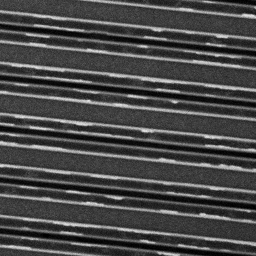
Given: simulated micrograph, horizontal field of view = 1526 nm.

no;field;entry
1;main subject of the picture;parallel lines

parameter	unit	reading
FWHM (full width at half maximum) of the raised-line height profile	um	0.0704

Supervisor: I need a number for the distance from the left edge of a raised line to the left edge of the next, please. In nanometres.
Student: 151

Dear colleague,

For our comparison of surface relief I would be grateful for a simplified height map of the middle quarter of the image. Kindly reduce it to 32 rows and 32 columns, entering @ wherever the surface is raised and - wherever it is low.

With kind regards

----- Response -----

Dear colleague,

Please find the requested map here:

--------------------------------
@-------------------------------
@@@@@@@@@@----------------------
@@@@@@@@@@@@@@@@@@@@------------
---@@@@@@@@@@@@@@@@@@@@@@@@@@---
------------@@@@@@@@@@@@@@@@@@@@
@@@@------------------@@@@@@@@@@
@@@@@@@@@@@@@------------------@
@@@@@@@@@@@@@@@@@@@@@@@---------
------@@@@@@@@@@@@@@@@@@@@@@@@@@
---------------@@@@@@@@@@@@@@@@@
-------------------------@@@@@@@
--------------------------------
--------------------------------
@@@-----------------------------
@@@@@@@@@@@@@-------------------
@@@@@@@@@@@@@@@@@@@@@@----------
-----@@@@@@@@@@@@@@@@@@@@@@@@@@-
---------------@@@@@@@@@@@@@@@@@
@@@@@@------------------@@@@@@@@
@@@@@@@@@@@@@@@@----------------
@@@@@@@@@@@@@@@@@@@@@@@@@-------
--------@@@@@@@@@@@@@@@@@@@@@@@@
------------------@@@@@@@@@@@@@@
---------------------------@@@@@
--------------------------------
--------------------------------
@@@@@@--------------------------
@@@@@@@@@@@@@@@-----------------
@@@@@@@@@@@@@@@@@@@@@@@@--------
--------@@@@@@@@@@@@@@@@@@@@@@@@
-----------------@@@@@@@@@@@@@@@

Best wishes